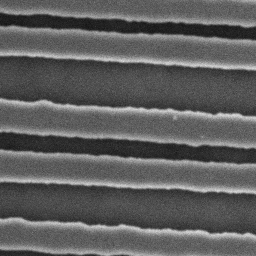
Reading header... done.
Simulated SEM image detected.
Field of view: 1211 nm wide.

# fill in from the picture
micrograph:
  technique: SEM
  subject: lines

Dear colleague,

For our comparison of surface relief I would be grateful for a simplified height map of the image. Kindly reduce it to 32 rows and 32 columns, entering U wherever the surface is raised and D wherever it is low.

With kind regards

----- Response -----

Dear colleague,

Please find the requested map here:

UUUUUUUUUUUUUUUUUUUUUUUUUUUUUUUU
UUUUUUUUUUUUUUUUUUUUUUUUUUUUUUUU
DDDDDDDDDDDDDDDUUUUUUUUUUUUUUUUU
UUUUDDDDDDDDDDDDDDDDDDDDDDDDDDDD
UUUUUUUUUUUUUUUUUUUUUUUDDDDDDDDD
UUUUUUUUUUUUUUUUUUUUUUUUUUUUUUUU
UUUUUUUUUUUUUUUUUUUUUUUUUUUUUUUU
DDDDDDDDDDDDDUUUUUUUUUUUUUUUUUUU
DDDDDDDDDDDDDDDDDDDDDDDDDDDUUUUU
DDDDDDDDDDDDDDDDDDDDDDDDDDDDDDDD
DDDDDDDDDDDDDDDDDDDDDDDDDDDDDDDD
DDDDDDDDDDDDDDDDDDDDDDDDDDDDDDDD
UDDDDDDDDDDDDDDDDDDDDDDDDDDDDDDD
UUUUUUUUUUUUUUDUUDDDDDDDDDDDDDDD
UUUUUUUUUUUUUUUUUUUUUUUUUUUUUUUD
UUUUUUUUUUUUUUUUUUUUUUUUUUUUUUUU
UUUUUUUUUUUUUUUUUUUUUUUUUUUUUUUU
DDDDDDDDDDDDDDDDDUUUUUUUUUUUUUUU
DDDDDDDDDDDDDDDDDDDDDDDDDDDDDDUU
UUUUUUUUUUUUUUDDDDDDDDDDDDDDDDDD
UUUUUUUUUUUUUUUUUUUUUUUUUUUUUDDD
UUUUUUUUUUUUUUUUUUUUUUUUUUUUUUUU
UUUUUUUUUUUUUUUUUUUUUUUUUUUUUUUU
DDDDDDDDDDDDDDDDDDDDUUUUUUUUUUUU
DDDDDDDDDDDDDDDDDDDDDDDDDDDDDDDD
DDDDDDDDDDDDDDDDDDDDDDDDDDDDDDDD
DDDDDDDDDDDDDDDDDDDDDDDDDDDDDDDD
UUUDDDDDDDDDDDDDDDDDDDDDDDDDDDDD
UUUUUUUUUUUUUUUUUUDDDDDDDDDDDDDD
UUUUUUUUUUUUUUUUUUUUUUUUUUUUUUUU
UUUUUUUUUUUUUUUUUUUUUUUUUUUUUUUU
DDDDDUUUUUUUUUUUUUUUUUUUUUUUUUUU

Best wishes